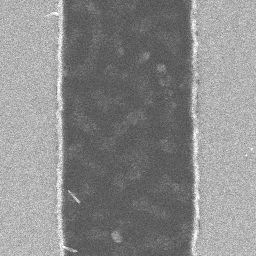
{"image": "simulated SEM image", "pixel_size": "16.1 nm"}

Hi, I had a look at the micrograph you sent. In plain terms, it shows one or a few lines or trenches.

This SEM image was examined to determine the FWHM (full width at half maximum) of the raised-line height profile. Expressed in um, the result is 2.2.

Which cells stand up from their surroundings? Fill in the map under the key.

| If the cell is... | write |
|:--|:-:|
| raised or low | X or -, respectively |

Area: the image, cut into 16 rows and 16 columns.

----XXXXXXXX----
----XXXXXXXX----
----XXXXXXXX----
----XXXXXXXX----
----XXXXXXXX----
----XXXXXXXX----
----XXXXXXXX----
----XXXXXXXX----
----XXXXXXXX----
----XXXXXXXX----
----XXXXXXXX----
----XXXXXXXX----
----XXXXXXXX----
----XXXXXXXX----
----XXXXXXXX----
----XXXXXXXX----